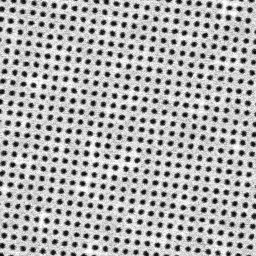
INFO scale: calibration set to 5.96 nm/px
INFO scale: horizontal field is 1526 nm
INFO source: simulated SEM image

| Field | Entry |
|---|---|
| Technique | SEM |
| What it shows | a regular array of holes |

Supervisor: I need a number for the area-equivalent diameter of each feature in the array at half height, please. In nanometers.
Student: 35.6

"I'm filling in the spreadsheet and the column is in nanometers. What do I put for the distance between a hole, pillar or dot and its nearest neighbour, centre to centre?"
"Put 58.4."